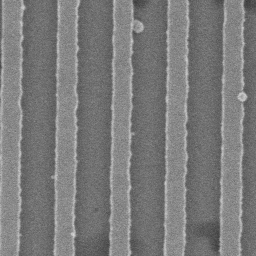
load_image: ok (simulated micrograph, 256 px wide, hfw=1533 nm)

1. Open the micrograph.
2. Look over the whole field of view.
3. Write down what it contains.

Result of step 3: lines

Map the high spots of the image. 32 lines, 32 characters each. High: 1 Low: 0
11100001110000111000011000001100
11100001110000111000011000001110
11100001110000111000011100001100
11100001110000111000011100001100
11100001110000111000011000001100
11100001110000111000011000001100
11100001110000110000011000001100
11100001110000110000011000001100
11100001110000110000011000001100
11100001110000111000011000001100
11100001110000110000011000001100
11100001100000110000011000001110
11100001110000110000011000001110
11100001110000110000011000001100
11100001100000110000011000001100
11100001100000110000011000001100
11100001110000110000011000001100
11100001100000110000011000001100
11000001100000110000011000001100
11100001100000110000011000001100
11100001110000110000011000001100
11100001100000110000011000001100
11000001100000110000011000001100
11100001100000110000011000001100
11100001100000110000011000001100
11100001100000110000011000001100
11000001100000110000011000001100
11000001100000110000011000001100
11000001100000110000011000001100
11000001100000110000011000011100
11000001100000110000011000011100
11000001100000110000011000011100